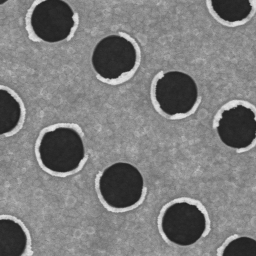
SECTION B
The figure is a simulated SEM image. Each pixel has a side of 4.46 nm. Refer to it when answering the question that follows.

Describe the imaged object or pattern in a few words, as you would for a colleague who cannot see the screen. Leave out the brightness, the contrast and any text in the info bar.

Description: holes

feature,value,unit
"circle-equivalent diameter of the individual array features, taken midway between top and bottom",191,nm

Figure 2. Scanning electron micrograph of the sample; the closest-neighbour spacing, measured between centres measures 320 nanometers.